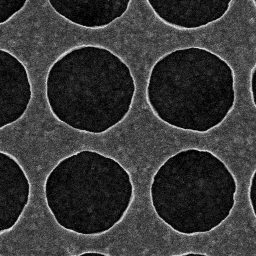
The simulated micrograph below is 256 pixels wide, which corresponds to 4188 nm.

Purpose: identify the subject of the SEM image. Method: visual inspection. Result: holes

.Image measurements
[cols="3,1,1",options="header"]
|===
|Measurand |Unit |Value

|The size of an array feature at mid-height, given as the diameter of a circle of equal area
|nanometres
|1380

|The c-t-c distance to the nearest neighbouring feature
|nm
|1670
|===